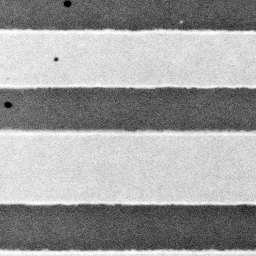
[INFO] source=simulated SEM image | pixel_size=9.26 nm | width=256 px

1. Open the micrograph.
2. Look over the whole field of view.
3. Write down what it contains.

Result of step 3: lines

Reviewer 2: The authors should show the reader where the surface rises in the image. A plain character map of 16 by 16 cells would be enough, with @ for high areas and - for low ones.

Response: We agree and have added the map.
----------------
----------------
@@@@@@@@@@@@@@@@
@@@@@@@@@@@@@@@@
@@@@@@@@@@@@@@@@
----------------
----------------
----------------
@@@@@@@@@@@@@@@@
@@@@@@@@@@@@@@@@
@@@@@@@@@@@@@@@@
@@@@@@@@@@@@@@@@
@@@@@@@@@@@@@@@@
----------------
----------------
----------------